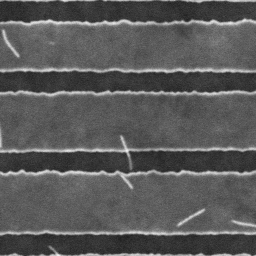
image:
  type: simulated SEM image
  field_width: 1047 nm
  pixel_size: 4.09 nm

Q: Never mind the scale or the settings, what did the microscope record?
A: lines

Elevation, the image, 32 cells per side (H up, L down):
LLLLLLLLLLLLLLLLLLLLLLLLLLLLLLLL
LLLLLLLLLLLLLLLLLLLLLLLLLLLLLLLL
LLLLLLLLLLLLLLLLLLLLLLLLLLLLLLLL
HHHHHHHHHHHHHHHHHHHHHHHHHHHHHHHH
HHHHHHHHHHHHHHHHHHHHHHHHHHHHHHHH
HHHHHHHHHHHHHHHHHHHHHHHHHHHHHHHH
HHHHHHHHHHHHHHHHHHHHHHHHHHHHHHHH
HHHHHHHHHHHHHHHHHHHHHHHHHHHHHHHH
HHHHHHHHHHHHHHHHHHHHHHHHHHHHHHHH
LLLLLLLLLLLLLLLLLLLLLLLLLLLLLLLL
LLLLLLLLLLLLLLLLLLLLLLLLLLLLLLLL
LHHHLLLHHHHHLHHHHHHLHLLLHLLHHHHH
HHHHHHHHHHHHHHHHHHHHHHHHHHHHHHHH
HHHHHHHHHHHHHHHHHHHHHHHHHHHHHHHH
HHHHHHHHHHHHHHHHHHHHHHHHHHHHHHHH
HHHHHHHHHHHHHHHHHHHHHHHHHHHHHHHH
HHHHHHHHHHHHHHHHHHHHHHHHHHHHHHHH
HHHHHHHHHHHHHHHHHHHHHHHHHHHHHHHH
HHHHHHHHHHHHHHHHHHHHHHHHHHHHHHHH
LLLLLLLLLLLLLLLLLLLLLLLLLLLLLLLL
LLLLLLLLLLLLLLLLLLLLLLLLLLLLLLLL
LHHHLHHLHHLLHLHLLLHHLLHHLHLLLLLH
HHHHHHHHHHHHHHHHHHHHHHHHHHHHHHHH
HHHHHHHHHHHHHHHHHHHHHHHHHHHHHHHH
HHHHHHHHHHHHHHHHHHHHHHHHHHHHHHHH
HHHHHHHHHHHHHHHHHHHHHHHHHHHHHHHH
HHHHHHHHHHHHHHHHHHHHHHHHHHHHHHHH
HHHHHHHHHHHHHHHHHHHHHHHHHHHHHHHH
HHHHHHHHHHHHHHHHHHHHHHHHHHHHHHHH
LLLLLLLLLLLLLLLLLLLLLLLLLLLLLLLL
LLLLLLLLLLLLLLLLLLLLLLLLLLLLLLLL
LLLLLLLLLLLLLLLLLLLLLLLLLLLLLLLL